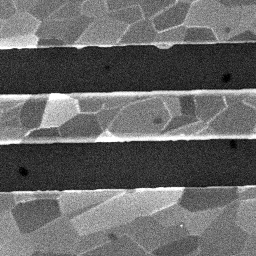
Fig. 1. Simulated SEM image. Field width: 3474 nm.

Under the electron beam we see lines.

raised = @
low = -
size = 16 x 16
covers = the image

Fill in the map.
@@@@@@@@@@@@@@@@
@@@@@@@@@@@@@@@@
@@@@@@@@@@@@@@@@
----------------
----------------
----------------
@@@@@@@@@@@@@@@@
@@@@@@@@@@@@@@@@
@@@@@@@@@@@@@@@@
----------------
----------------
----------------
@@@@@@@@@@@@@@@@
@@@@@@@@@@@@@@@@
@@@@@@@@@@@@@@@@
@@@@@@@@@@@@@@@@